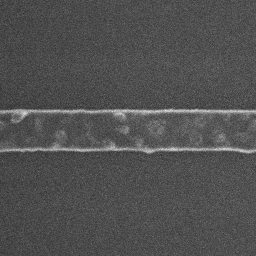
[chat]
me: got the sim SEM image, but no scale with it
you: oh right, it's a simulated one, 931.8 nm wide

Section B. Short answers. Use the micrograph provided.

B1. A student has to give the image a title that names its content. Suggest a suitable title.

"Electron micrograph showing one or a few lines or trenches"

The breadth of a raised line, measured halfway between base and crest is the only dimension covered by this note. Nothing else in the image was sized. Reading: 144 nanometers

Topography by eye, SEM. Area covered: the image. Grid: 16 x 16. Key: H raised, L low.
LLLLLLLLLLLLLLLL
LLLLLLLLLLLLLLLL
LLLLLLLLLLLLLLLL
LLLLLLLLLLLLLLLL
LLLLLLLLLLLLLLLL
LLLLLLLLLLLLLLLL
LLLLLLLLLLLLLLLL
HHHHHHHHHHHHHHHH
HHHHHHHHHHHHHHHH
LLLLLLLLLLLLLLLL
LLLLLLLLLLLLLLLL
LLLLLLLLLLLLLLLL
LLLLLLLLLLLLLLLL
LLLLLLLLLLLLLLLL
LLLLLLLLLLLLLLLL
LLLLLLLLLLLLLLLL